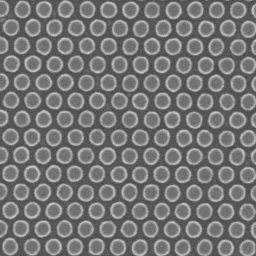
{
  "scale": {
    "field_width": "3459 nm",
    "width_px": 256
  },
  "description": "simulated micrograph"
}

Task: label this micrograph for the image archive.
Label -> a regular array of raised bodies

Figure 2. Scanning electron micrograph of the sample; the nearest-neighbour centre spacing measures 281 nanometres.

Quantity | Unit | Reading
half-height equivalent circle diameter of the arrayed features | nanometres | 208